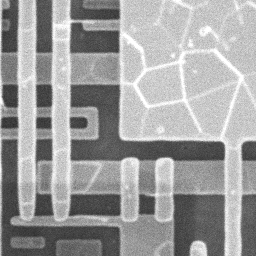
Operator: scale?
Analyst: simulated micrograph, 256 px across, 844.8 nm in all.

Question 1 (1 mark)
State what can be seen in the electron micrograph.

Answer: wiring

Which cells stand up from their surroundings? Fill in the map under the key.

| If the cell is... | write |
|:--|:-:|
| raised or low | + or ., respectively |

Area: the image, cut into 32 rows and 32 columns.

..++...++......+++++++++++++++++
..++...++......+++++++++++++++++
..++...++......+++++++++++++++++
..++...++......+++++++++++++++++
..++...++......+++++++++++++++++
..++...++......+++++++++++++++++
..++...++......+++++++++++++++++
..++...++......+++++++++++++++++
..++...++......+++++++++++++++++
..++...++......+++++++++++++++++
..++...++......+++++++++++++++++
..++...++......+++++++++++++++++
..++...++......+++++++++++++++++
..++...++......+++++++++++++++++
..++...++......+++++++++++++++++
..++...++......+++++++++++++++++
..++...++......+++++++++++++++++
..++...++........++..+..++++++++
..++...++...................++..
..++...++...................++..
..++...++......++...++......++..
..++...++......++...++......++..
..++...++......++...++......++..
..++...++......++...++......++..
..++...++......++..+++......++..
..++...++......++..+++......++..
...+...++......++..+++......++..
.......+........+...+.......++..
............................++..
............................++..
........................+...++..
........................++..++..